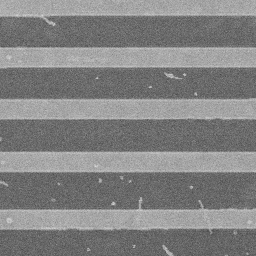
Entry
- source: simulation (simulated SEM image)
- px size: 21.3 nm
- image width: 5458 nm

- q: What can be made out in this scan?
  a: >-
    lines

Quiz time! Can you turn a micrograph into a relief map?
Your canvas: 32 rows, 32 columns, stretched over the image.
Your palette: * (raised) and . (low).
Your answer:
********************************
********************************
................................
................................
................................
................................
********************************
********************************
................................
................................
................................
................................
********************************
********************************
********************************
................................
................................
................................
................................
********************************
********************************
................................
................................
................................
................................
................................
********************************
********************************
*****..*...**...**........*.....
................................
................................
................................